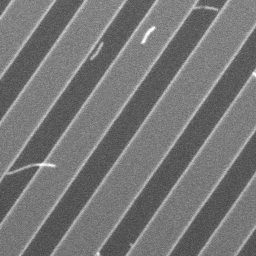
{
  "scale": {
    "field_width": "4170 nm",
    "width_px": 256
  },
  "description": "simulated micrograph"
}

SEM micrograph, lines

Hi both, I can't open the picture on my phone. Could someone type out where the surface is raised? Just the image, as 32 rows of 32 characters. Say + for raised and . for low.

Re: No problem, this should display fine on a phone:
.++++++...+++++....++++++...++++
++++++....+++++...++++++...+++++
+++++....+++++....+++++....+++++
+++++...+++++....+++++....++++++
++++....+++++...++++++...++++++.
+++....+++++....+++++....+++++..
++....+++++....+++++....++++++..
++...++++++...++++++...++++++...
+....+++++....+++++....+++++....
....+++++....+++++....++++++...+
...++++++...++++++...++++++....+
...+++++....+++++....+++++....++
..+++++....+++++....++++++...+++
.+++++....+++++....++++++....+++
.+++++...++++++...++++++....++++
+++++....+++++....++++++...+++++
++++....+++++....++++++....+++++
++++...++++++...++++++....+++++.
+++....+++++....+++++....+++++..
++....+++++....++++++...++++++..
++...++++++...++++++....+++++...
+....+++++....+++++....+++++....
....+++++....++++++...++++++...+
...+++++....++++++....+++++....+
..++++++...++++++....+++++....++
..+++++....++++++...+++++....+++
.+++++....++++++....+++++....+++
++++++...++++++....+++++....++++
+++++....+++++....+++++....+++++
++++....++++++...++++++...+++++.
++++...++++++....+++++....+++++.
+++....+++++....+++++....+++++..